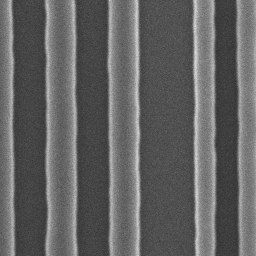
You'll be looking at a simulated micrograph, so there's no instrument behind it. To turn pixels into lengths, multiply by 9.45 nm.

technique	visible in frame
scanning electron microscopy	groups of lines, slits or small figures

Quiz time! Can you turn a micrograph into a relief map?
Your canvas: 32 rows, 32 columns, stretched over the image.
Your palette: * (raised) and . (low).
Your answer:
*.....***.....***.......***...**
*.....***.....***.......***...**
*.....***.....***.......***...**
*.....***.....***.......***...**
*.....***.....***.......***...**
*.....***.....***.......***...**
*.....***.....***.......***...**
*.....***.....***.......***...**
*.....***.....***.......***...**
*.....***.....***.......***...**
*.....***.....***.......***...**
*.....***.....***........**...**
*.....***.....***........**...**
*.....***.....***........**...**
*.....***.....***........**...**
*.....***.....***.......***...**
*.....***.....***........**...**
*.....***.....***.......***...**
*.....***.....***.......***...**
**....***.....***........**...**
**....***.....***........**...**
**....***.....***........**...**
**....***.....***........**...**
**....***.....***........**...**
**....***.....***........**...**
*.....***.....***........**...**
**....***.....***........**...**
**....***.....***........**...**
**....***.....***........**...**
**....***.....***........**...**
**....***.....***........**...**
**....***.....***........**...**